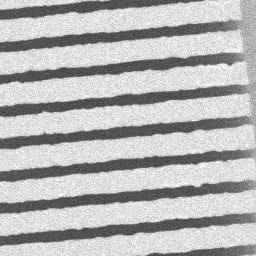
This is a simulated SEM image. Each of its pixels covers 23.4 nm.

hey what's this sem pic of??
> parallel lines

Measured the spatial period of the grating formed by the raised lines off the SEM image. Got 752 nanometers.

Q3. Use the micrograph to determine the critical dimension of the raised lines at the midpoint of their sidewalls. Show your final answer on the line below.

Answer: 0.515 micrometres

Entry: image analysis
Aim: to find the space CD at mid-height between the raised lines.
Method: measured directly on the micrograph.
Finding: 0.227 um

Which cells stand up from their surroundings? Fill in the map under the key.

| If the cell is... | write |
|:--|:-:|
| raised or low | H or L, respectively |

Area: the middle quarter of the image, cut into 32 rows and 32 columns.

HHHHHHHLLLLLLLLLLLLLLLLLLLLLLLLL
LLLLLLLLLLLLLLLLLLLLLHLLLLHHHHHH
LLLLLLLLLLLLLLHHHHHHHHHHHHHHHHHH
LHHHHHHHHHHHHHHHHHHHHHHHHHHHHHHH
HHHHHHHHHHHHHHHHHHHHHHHHHHHHHHHH
HHHHHHHHHHHHHHHHHHHHHHHHHHHHHHHH
HHHHHHHHHHHHHHHHHHHHHHHHHHHHHLLL
HHHHHHHHHHHHHHHHHHHLLLLLLLLLLLLL
HHHHHHHHLLLLLLLLLLLLLLLLLLLLLLLL
LLLLLLLLLLLLLLLLLLLLLLLLLHHHHHHH
LLLLLLLLLLLLHHLHHHHHHHHHHHHHHHHH
LLHHHHHHHHHHHHHHHHHHHHHHHHHHHHHH
HHHHHHHHHHHHHHHHHHHHHHHHHHHHHHHH
HHHHHHHHHHHHHHHHHHHHHHHHHHHHHHHH
HHHHHHHHHHHHHHHHHHHHHHHHHHHHHLLL
HHHHHHHHHHHHHHHHLHLLLLLLLLLLLLLL
HHHHHHHLLLLLLLLLLLLLLLLLLLLLLLLL
LLLLLLLLLLLLLLLLLLLLLLLHLLHHHHHH
LLLLLLLLLLLLLLLHHHHHHHHHHHHHHHHH
LLLLHHHHHHHHHHHHHHHHHHHHHHHHHHHH
HHHHHHHHHHHHHHHHHHHHHHHHHHHHHHHH
HHHHHHHHHHHHHHHHHHHHHHHHHHHHHHHH
HHHHHHHHHHHHHHHHHHHHHHHHHHHHHHHH
HHHHHHHHHHHHHHHHHHLHLLLLLLLLLLLL
HHHHHHHHHHLLLLLLLLLLLLLLLLLLLLLL
HLLLLLLLLLLLLLLLLLLLLLLLLHHHHHHH
LLLLLLLLLLLLLLLLHHHHHHHHHHHHHHHH
LLLHHHHHHHHHHHHHHHHHHHHHHHHHHHHH
HHHHHHHHHHHHHHHHHHHHHHHHHHHHHHHH
HHHHHHHHHHHHHHHHHHHHHHHHHHHHHHHH
HHHHHHHHHHHHHHHHHHHHHHHHHHHHHHLL
HHHHHHHHHHHHHHHHHHHHLLLLLLLLLLLL